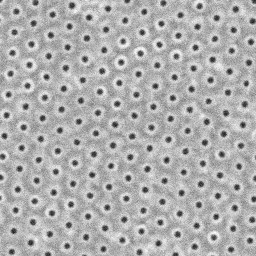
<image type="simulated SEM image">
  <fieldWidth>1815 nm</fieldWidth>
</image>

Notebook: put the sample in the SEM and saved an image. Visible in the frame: a regular array of holes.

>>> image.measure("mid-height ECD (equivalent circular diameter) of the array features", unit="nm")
51.2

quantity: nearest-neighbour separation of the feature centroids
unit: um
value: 0.146